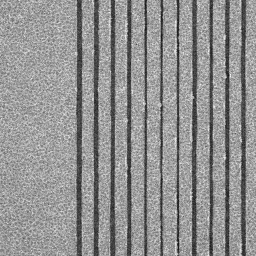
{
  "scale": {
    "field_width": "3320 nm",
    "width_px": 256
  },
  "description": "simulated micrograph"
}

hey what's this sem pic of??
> parallel lines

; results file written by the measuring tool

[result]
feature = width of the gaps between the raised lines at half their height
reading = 53.5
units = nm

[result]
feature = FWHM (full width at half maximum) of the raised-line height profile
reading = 0.144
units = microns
